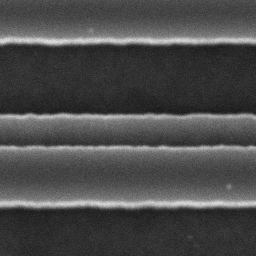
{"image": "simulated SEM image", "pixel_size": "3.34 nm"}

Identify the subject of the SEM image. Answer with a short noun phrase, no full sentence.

lines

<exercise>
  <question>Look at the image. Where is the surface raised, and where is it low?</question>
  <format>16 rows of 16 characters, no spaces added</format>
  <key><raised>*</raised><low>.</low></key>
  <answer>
****************
****************
..****.*.**.*..*
................
................
................
................
****************
****************
****************
****************
****************
****************
................
................
................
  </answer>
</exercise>